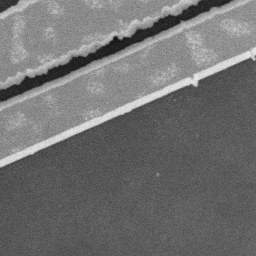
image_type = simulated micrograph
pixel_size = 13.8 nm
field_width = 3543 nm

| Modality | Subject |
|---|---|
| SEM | one or a few lines or trenches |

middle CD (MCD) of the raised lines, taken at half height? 725 nm